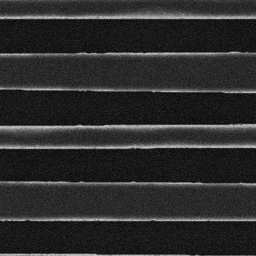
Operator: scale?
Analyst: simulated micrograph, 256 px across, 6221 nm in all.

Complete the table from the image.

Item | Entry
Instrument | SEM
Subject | lines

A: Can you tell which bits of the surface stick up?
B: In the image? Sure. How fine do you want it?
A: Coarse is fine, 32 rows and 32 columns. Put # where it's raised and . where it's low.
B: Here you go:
################################
################################
................................
................................
................................
................................
................................
################################
################################
################################
################################
............................####
................................
................................
................................
................................
################################
################################
################................
................................
................................
................................
................................
################################
################################
################################
################################
.##.#####.....####.#############
................................
................................
................................
................................